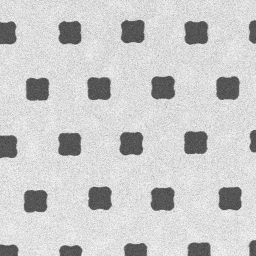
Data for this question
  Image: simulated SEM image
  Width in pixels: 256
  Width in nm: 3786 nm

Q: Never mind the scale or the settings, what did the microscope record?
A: a regular array of holes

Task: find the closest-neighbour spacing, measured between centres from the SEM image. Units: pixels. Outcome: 62.6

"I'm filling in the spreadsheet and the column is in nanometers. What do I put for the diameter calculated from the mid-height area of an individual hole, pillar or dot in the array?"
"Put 371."